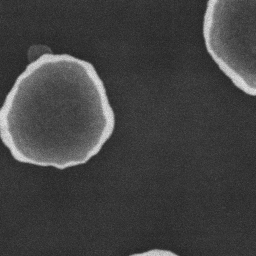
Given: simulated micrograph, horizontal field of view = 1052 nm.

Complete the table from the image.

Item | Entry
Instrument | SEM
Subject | raised bodies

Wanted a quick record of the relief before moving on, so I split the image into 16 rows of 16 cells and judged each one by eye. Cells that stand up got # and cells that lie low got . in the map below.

.............###
.............###
.............###
.............###
..####........##
.#####.........#
#######.........
#######.........
#######.........
.#####..........
................
................
................
................
................
................